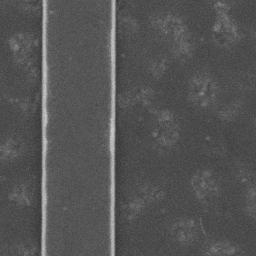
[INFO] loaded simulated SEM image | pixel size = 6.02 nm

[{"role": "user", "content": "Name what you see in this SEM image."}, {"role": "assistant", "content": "one or a few lines or trenches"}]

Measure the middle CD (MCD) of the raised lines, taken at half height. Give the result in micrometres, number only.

0.423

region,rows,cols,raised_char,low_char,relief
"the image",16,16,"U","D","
DDDUUUUDDDDDDDDD
DDDUUUUDDDDDDDDD
DDDUUUUDDDDDDDDD
DDDUUUUDDDDDDDDD
DDDUUUUDDDDDDDDD
DDDUUUUDDDDDDDDD
DDDUUUUDDDDDDDDD
DDDUUUUDDDDDDDDD
DDDUUUUDDDDDDDDD
DDDUUUUDDDDDDDDD
DDDUUUUDDDDDDDDD
DDDUUUUDDDDDDDDD
DDDUUUUDDDDDDDDD
DDDUUUUDDDDDDDDD
DDDUUUUDDDDDDDDD
DDDUUUUDDDDDDDDD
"